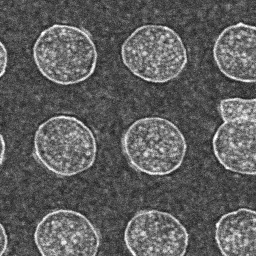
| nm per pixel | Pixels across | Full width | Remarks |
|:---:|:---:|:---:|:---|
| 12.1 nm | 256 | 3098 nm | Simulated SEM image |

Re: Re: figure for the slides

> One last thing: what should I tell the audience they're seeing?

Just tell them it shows raised bodies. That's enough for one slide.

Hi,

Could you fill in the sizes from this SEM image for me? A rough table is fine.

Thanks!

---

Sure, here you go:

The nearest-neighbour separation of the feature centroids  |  1080 nm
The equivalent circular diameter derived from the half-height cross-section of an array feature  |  719 nm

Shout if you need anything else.